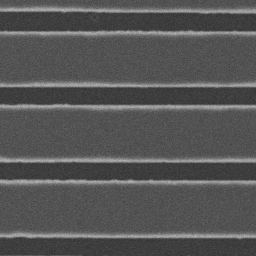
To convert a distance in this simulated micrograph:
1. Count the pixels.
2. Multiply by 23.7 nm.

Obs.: lines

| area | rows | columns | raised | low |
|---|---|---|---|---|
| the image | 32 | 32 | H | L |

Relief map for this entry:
HHHHHHHHHHHHHHHHHHHHHHHHHHHHHHHH
LLLLLLLLLLLLLLLLLLLLLLLLLLLLLLLL
LLLLLLLLLLLLLLLLLLLLLLLLLLLLLLLL
LLLLLLLLLLLLLLLLLLLLLLLLLLLLLLLL
HHHHHHHHHHHHHHHHHHHHHHHHHHHHHHHH
HHHHHHHHHHHHHHHHHHHHHHHHHHHHHHHH
HHHHHHHHHHHHHHHHHHHHHHHHHHHHHHHH
HHHHHHHHHHHHHHHHHHHHHHHHHHHHHHHH
HHHHHHHHHHHHHHHHHHHHHHHHHHHHHHHH
HHHHHHHHHHHHHHHHHHHHHHHHHHHHHHHH
HHHHHHHHHHHHHHHHHHHHHHHHHHHHHHHH
LLLLLLLLLLLLLLLLLLLLLLLLLLLLLLLL
LLLLLLLLLLLLLLLLLLLLLLLLLLLLLLLL
HHHHHHHHHHHHHHHHHHHHHHHHHHHHHHHH
HHHHHHHHHHHHHHHHHHHHHHHHHHHHHHHH
HHHHHHHHHHHHHHHHHHHHHHHHHHHHHHHH
HHHHHHHHHHHHHHHHHHHHHHHHHHHHHHHH
HHHHHHHHHHHHHHHHHHHHHHHHHHHHHHHH
HHHHHHHHHHHHHHHHHHHHHHHHHHHHHHHH
HHHHHHHHHHHHHHHHHHHHHHHHHHHHHHHH
LLLLLLLLLLLLLLLLLLLLLLLLLLLLLLLL
LLLLLLLLLLLLLLLLLLLLLLLLLLLLLLLL
LLLLLLLLLLLLLLLLLLLLLLLLLLLLLLLL
HHHHHHHHHHHHHHHHHHHHHHHHHHHHHHHH
HHHHHHHHHHHHHHHHHHHHHHHHHHHHHHHH
HHHHHHHHHHHHHHHHHHHHHHHHHHHHHHHH
HHHHHHHHHHHHHHHHHHHHHHHHHHHHHHHH
HHHHHHHHHHHHHHHHHHHHHHHHHHHHHHHH
HHHHHHHHHHHHHHHHHHHHHHHHHHHHHHHH
HHLHHHHHHHHHHHHHHHHHHHHHHHHHHHHH
LLLLLLLLLLLLLLLLLLLLLLLLLLLLLLLL
LLLLLLLLLLLLLLLLLLLLLLLLLLLLLLLL